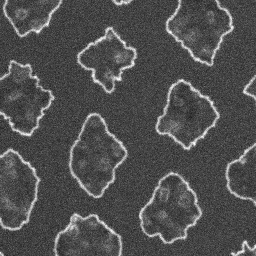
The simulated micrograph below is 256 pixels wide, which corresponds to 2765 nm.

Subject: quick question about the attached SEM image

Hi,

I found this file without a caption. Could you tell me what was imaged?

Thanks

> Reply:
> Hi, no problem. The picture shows raised bodies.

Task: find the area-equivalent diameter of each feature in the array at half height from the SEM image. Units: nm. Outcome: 628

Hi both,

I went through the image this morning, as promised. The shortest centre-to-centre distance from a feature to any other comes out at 1020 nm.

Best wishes